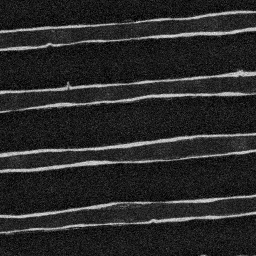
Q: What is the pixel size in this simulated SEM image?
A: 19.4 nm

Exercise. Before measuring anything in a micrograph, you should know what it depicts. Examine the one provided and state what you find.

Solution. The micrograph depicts parallel lines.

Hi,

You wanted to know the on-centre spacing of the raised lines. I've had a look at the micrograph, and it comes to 1190 nm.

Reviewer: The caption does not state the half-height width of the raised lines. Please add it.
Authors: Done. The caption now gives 17.4 px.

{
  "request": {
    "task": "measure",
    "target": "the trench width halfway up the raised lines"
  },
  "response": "853 nm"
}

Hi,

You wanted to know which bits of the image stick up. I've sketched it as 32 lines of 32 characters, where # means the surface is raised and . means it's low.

................................
..............................#.
...................#############
.....###########################
####################............
#########.......................
................................
................................
................................
...........................#####
................################
.###############################
################................
####............................
................................
................................
................................
.....................###########
..............##################
##########################......
##########......................
................................
................................
................................
................................
..............##################
.......#########################
#####################...........
#######.........................
................................
................................
................................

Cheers